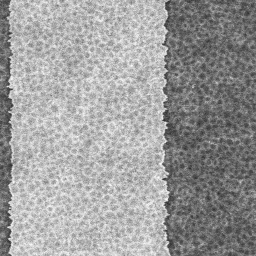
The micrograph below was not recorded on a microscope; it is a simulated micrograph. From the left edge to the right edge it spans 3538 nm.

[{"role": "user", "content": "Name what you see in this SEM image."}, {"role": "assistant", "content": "one or a few lines or trenches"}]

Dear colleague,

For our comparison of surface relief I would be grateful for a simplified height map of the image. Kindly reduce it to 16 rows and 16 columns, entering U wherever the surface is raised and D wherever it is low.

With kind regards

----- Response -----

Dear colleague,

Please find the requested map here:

DUUUUUUUUUDDDDDD
DUUUUUUUUUDDDDDD
DUUUUUUUUUDDDDDD
DUUUUUUUUUDDDDDD
DUUUUUUUUUDDDDDD
DUUUUUUUUUDDDDDD
DUUUUUUUUUDDDDDD
DUUUUUUUUUDDDDDD
DUUUUUUUUUDDDDDD
DUUUUUUUUUDDDDDD
DUUUUUUUUUDDDDDD
DUUUUUUUUUDDDDDD
DUUUUUUUUUDDDDDD
DUUUUUUUUUDDDDDD
DUUUUUUUUUDDDDDD
DUUUUUUUUUDDDDDD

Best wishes